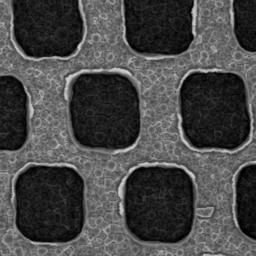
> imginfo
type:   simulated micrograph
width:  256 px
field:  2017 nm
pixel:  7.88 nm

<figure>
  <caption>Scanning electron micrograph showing holes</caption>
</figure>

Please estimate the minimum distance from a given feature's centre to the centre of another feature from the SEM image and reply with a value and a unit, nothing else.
853 nanometers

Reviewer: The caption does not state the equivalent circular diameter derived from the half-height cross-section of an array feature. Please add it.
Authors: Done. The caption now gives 620 nanometres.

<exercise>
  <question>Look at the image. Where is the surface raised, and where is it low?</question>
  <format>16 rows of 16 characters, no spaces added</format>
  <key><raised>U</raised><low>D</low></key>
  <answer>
UDDDDUUUDDDDUUUD
UDDDDUUUDDDDUUUD
UDDDDUUUDDDDUUUD
UUDDUUUUUUUUUUUU
UUUUUUUUUUUUDUUU
DUUUDDDDUUUDDDDU
DDUUDDDDDUUDDDDU
DDUUDDDDDUUDDDDD
DDUUUDDDDUUUDDDD
UUUUUUUUUUUUUUUU
UUDDUUUUUDDUUUUD
UDDDDUUUDDDDUUUD
UDDDDUUUDDDDUUUD
UDDDDUUUDDDDUUUD
UDDDDUUUDDDDUUUD
UUUUUUUUUUUUUUUU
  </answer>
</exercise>